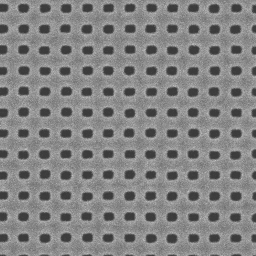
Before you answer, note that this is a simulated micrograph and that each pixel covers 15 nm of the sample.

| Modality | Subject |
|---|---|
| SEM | a regular array of holes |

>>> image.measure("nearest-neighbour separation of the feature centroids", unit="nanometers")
308